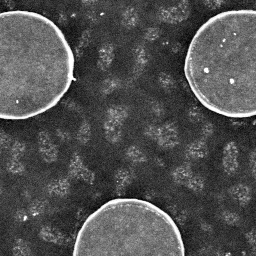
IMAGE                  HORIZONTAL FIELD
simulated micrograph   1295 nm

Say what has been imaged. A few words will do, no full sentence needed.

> raised bodies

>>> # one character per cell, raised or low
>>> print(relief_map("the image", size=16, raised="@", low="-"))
----------------
@@@----------@@@
@@@@--------@@@@
@@@@--------@@@@
@@@@@-------@@@@
@@@@--------@@@@
@@@----------@@@
----------------
----------------
----------------
----------------
----------------
----------------
------@@@@------
-----@@@@@@-----
-----@@@@@@-----